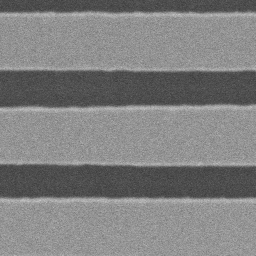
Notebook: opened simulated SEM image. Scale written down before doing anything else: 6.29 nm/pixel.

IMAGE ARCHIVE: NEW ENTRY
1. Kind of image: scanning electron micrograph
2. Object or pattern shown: lines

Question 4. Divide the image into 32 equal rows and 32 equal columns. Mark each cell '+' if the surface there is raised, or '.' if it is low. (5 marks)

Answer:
................................
................................
++++++++++++++++++++++++++++++++
++++++++++++++++++++++++++++++++
++++++++++++++++++++++++++++++++
++++++++++++++++++++++++++++++++
++++++++++++++++++++++++++++++++
++++++++++++++++++++++++++++++++
++++++++++++++++++++++++++++++++
................................
................................
................................
................................
..++++..++.+++++++++++++++++++++
++++++++++++++++++++++++++++++++
++++++++++++++++++++++++++++++++
++++++++++++++++++++++++++++++++
++++++++++++++++++++++++++++++++
++++++++++++++++++++++++++++++++
++++++++++++++++++++++++++++++++
.++....+++++++++++++++++++++++++
................................
................................
................................
................................
++++++++++++++++++++++++++++++++
++++++++++++++++++++++++++++++++
++++++++++++++++++++++++++++++++
++++++++++++++++++++++++++++++++
++++++++++++++++++++++++++++++++
++++++++++++++++++++++++++++++++
++++++++++++++++++++++++++++++++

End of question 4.